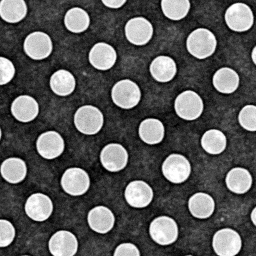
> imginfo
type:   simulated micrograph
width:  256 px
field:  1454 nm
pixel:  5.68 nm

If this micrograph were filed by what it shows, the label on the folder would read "a regular array of raised bodies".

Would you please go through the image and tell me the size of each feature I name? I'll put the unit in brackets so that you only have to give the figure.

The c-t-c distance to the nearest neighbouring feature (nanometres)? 253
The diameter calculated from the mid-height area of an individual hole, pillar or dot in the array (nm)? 154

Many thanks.